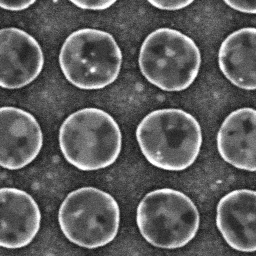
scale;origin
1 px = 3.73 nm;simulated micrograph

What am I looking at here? raised bodies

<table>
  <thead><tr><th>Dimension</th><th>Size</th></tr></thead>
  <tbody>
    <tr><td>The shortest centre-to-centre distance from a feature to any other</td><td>293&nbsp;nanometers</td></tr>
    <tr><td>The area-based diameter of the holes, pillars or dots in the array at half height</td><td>226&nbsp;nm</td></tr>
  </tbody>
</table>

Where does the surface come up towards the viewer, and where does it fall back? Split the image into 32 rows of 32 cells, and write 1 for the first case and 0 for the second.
11110000001111000001111100000111
00000000000000000000000000000011
00000000000000000000000000000000
00000000000000000000000000000000
11110000011111000001111000000111
11111000111111000011111100001111
11111000111111100011111110011111
11111001111111100111111110011111
11111000111111100011111110001111
11110000111111100011111100001111
11100000011111000001111100000111
00000000000000000000000000000000
00000000000000000000000000000000
01000000000000000000000000000000
11110000011111000011111100000111
11111000111111000011111110001111
11111000111111100111111110011111
11111000111111100111111110011111
11111000111111100011111110011111
11110000111111100011111110001111
11100000011111000001111100000111
00000000000000000000000000000000
00000000000000000000000000000000
00000000000000000000000000000000
11110000111111000011111000001111
11110000111111000011111100011111
11111001111111100111111110011111
11111001111111100111111110011111
11111000111111100111111110011111
11110000111111000011111100001111
11100000001110000001111000000111
00000000000000000000000000000000